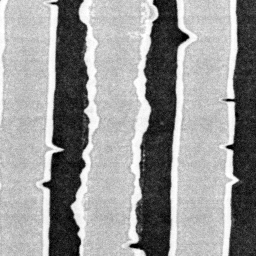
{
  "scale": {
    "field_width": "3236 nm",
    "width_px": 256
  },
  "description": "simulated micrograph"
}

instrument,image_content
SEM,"one or a few lines or trenches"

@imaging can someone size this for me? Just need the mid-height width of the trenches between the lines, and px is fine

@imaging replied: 36.8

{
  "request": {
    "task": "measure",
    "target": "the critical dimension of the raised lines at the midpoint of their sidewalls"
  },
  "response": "675 nanometres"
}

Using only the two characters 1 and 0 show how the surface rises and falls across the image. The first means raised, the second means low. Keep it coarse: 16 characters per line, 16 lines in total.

1110011111011110
1110011110011110
1110001110001110
1110001110011110
1110001110011100
1110001110011100
1110001110011100
1110001110011110
1110001110011100
1110011110011100
1110011110011100
1110011110011100
1110011100011100
1110011100011100
1110011100011100
1110011100011100